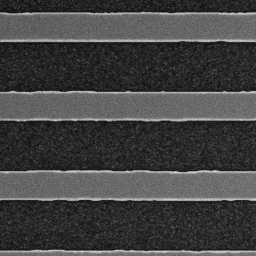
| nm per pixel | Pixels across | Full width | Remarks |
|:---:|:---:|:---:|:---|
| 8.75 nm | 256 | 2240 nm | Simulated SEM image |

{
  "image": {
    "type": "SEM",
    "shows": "lines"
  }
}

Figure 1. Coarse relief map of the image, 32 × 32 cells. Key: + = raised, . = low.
................................
................................
++++++++++++++++++++++++++++++++
++++++++++++++++++++++++++++++++
++++++++++++++++++++++++++++++++
................................
................................
................................
................................
................................
................................
.+..++++++++...++...........+.++
++++++++++++++++++++++++++++++++
++++++++++++++++++++++++++++++++
++++++++++++++++++++++++++++++++
................................
................................
................................
................................
................................
................................
++++++++++++++++++++++++++++++++
++++++++++++++++++++++++++++++++
++++++++++++++++++++++++++++++++
++++++++++++++++++++++++++++++++
................................
................................
................................
................................
................................
................................
++++++++++++++++++++++++++++++++